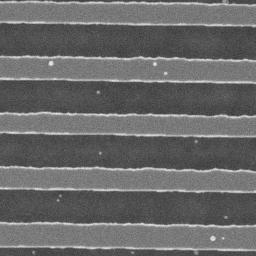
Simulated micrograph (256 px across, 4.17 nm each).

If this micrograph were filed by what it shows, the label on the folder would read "lines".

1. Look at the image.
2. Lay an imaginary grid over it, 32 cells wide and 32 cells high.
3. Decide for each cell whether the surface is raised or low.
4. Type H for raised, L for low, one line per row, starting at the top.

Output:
HHHHHHHHHHHHHHHHHHHHHHHHHHHHHHLL
HHHHHHHHHHHHHHHHHHHHHHHHHHHHHHHH
HHHHHHHHHHHHHHHHHHHHHHHHHHHHHHHH
LLLLLLLLLLLLLLLLLLLLLLLLLLLLLLLL
LLLLLLLLLLLLLLLLLLLLLLLLLLLLLLLL
LLLLLLLLLLLLLLLLLLLLLLLLLLLLLLLL
LLLLLLLLLLLLLLLLLLLLLLLLLLLLLLLL
HHHHHHHHHHHHHHHHHHHHHHHHHHHHLLHL
HHHHHHHHHHHHHHHHHHHHHHHHHHHHHHHH
HHHHHHHHHHHHHHHHHHHHHHHHHHHHHHHH
LLLLLLLLLLLLLLLLLLLLLLLLLLLLLLLL
LLLLLLLLLLLLLLLLLLLLLLLLLLLLLLLL
LLLLLLLLLLLLLLLLLLLLLLLLLLLLLLLL
LLLLLLLLLLLLLLLLLLLLLLLLLLLLLLLL
HHHHHHHHHHHHHHHHHHHHHHHHHHHHHLHH
HHHHHHHHHHHHHHHHHHHHHHHHHHHHHHHH
HHHHHHHHHHHHHHHHHHHHHHHHHHHHHHHH
LLLLLLLLLLLLLLLLLLLLLLLLLLLLLLLL
LLLLLLLLLLLLLLLLLLLLLLLLLLLLLLLL
LLLLLLLLLLLLLLLLLLLLLLLLLLLLLLLL
LLLLLLLLLLLLLLLLLLLLLLLLLLLLLLLL
HHHHHHHHHHHHHHHHHHHHHHHHHHHHHHHH
HHHHHHHHHHHHHHHHHHHHHHHHHHHHHHHH
HHHHHHHHHHHHHHHHHHHHHHHHHHHHHHHH
LLLLLLLLLLLLLLLLLLLLLLLLLLLLLLLL
LLLLLLLLLLLLLLLLLLLLLLLLLLLLLLLL
LLLLLLLLLLLLLLLLLLLLLLLLLLLLLLLL
LLLLLLLLLLLLLLLLLLLLLLLLLLLLLLLL
HHHHHHHHHHHHHHHHHHHHHHHHHHHHHHHH
HHHHHHHHHHHHHHHHHHHHHHHHHHHHHHHH
HHHHHHHHHHHHHHHHHHHHHHHHHHHHHHHH
LLLLLLLLLLLLLLLLLLLLLLLLLLLLLLLL